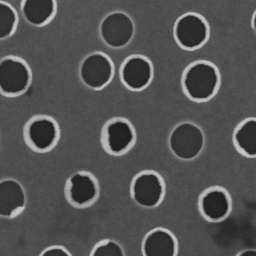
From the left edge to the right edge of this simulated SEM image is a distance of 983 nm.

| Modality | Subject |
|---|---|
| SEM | a regular array of holes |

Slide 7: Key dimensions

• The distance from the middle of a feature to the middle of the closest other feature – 0.235 microns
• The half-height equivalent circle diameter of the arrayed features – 113 nm